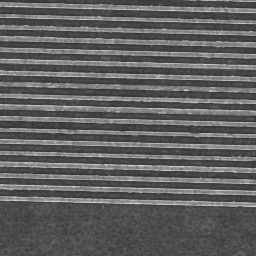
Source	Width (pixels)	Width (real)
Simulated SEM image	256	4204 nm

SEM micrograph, parallel lines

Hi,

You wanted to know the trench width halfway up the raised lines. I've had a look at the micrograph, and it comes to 121 nanometers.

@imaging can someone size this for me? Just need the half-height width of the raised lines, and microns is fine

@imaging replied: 0.0615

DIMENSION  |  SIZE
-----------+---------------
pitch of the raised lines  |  11.4 pixels